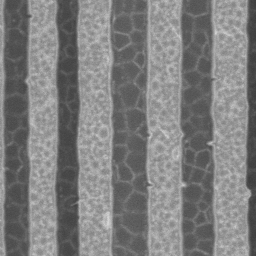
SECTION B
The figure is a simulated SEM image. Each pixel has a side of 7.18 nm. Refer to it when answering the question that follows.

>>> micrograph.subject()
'parallel lines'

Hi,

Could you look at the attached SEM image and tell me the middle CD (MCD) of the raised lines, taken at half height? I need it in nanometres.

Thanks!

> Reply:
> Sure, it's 231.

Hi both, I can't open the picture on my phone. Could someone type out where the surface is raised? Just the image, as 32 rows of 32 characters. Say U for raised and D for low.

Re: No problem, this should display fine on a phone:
DDDDUUUDDDUUUUDDDDDUUUUDDDDUUUUD
DDDDUUUDDDUUUUDDDDDUUUUDDDDUUUUD
DDDDUUUDDDUUUUDDDDDUUUDDDDDUUUUD
DDDDUUUDDDUUUUDDDDDUUUUDDDDUUUUD
DDDDUUUDDDUUUUDDDDDUUUUDDDDUUUUD
DDDDUUUDDDUUUUDDDDDUUUUDDDDUUUUD
DDDDUUUDDDUUUUDDDDDUUUUDDDDUUUUD
DDDDUUUDDDUUUUDDDDDUUUUDDDDUUUUD
DDDDUUUDDDUUUUDDDDDUUUDDDDDUUUUD
UDDDUUUDDDUUUUDDDDDUUUUDDDDUUUUD
UDDUUUUDDDUUUUDDDDUUUUUDDDDUUUUD
DDDDUUUDDDUUUUDDDDUUUUDDDDDUUUUD
DDDDUUUDDDUUUUDDDDUUUUDDDDDUUUUD
DDDDUUUDDDUUUUDDDDUUUUDDDDDUUUUD
DDDDUUUDDDUUUUDDDDUUUUDDDDDUUUUD
DDDDUUUDDDUUUUDDDDDUUUDDDDDUUUUD
DDDDUUUDDDUUUUDDDDDUUUUDDDDUUUUD
DDDDUUUDDDUUUUDDDDDUUUUDDDDUUUUD
DDDDUUUDDDUUUUDDDDDUUUUDDDDUUUUD
DDDDUUUDDDUUUUDDDDDUUUUDDDDUUUUD
DDDDUUUDDDUUUUDDDDUUUUUDDDDUUUUD
DDDDUUUDDDUUUUDDDDUUUUUDDDDUUUUD
DDDDUUUDDDUUUUDDDDDUUUUDDDDUUUUD
UDDDUUUDDDUUUUDDDDDUUUUDDDDUUUUD
UDDDUUUDDDUUUUDDDDDUUUUDDDDUUUUD
DDDDUUUDDDUUUUDDDDDUUUUDDDDUUUUD
DDDDUUUDDDUUUUDDDDDUUUUDDDDUUUUD
DDDDUUUDDDUUUUDDDDDUUUUDDDDUUUUD
DDDDUUUDDDUUUUDDDDDUUUUDDDDUUUUD
DDDDUUUDDDUUUUDDDDDUUUUDDDDUUUUD
DDDDUUUDDDUUUUDDDDDUUUUDDDDUUUUD
UDDDUUUDDDUUUUDDDDDUUUUDDDDUUUUD